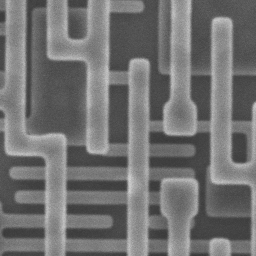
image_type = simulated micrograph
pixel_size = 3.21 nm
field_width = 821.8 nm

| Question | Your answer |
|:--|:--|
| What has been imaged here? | wiring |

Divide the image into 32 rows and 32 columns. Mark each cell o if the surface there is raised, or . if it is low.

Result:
.oo...oo...ooo........oo........
.oo...oo...ooo........oo........
.oo...oo...ooo........oo...oo...
.oo...oo...ooo........oo..ooo...
.oo...ooo..ooo.......ooo..ooo...
.oo...oooooooo.......ooo..ooo...
.oo...oooooooo.......ooo..ooo...
.oo.......oooo..oo...ooo..ooo...
.oo........ooo..ooo..ooo..ooo...
.oo........oo...ooo..ooo..ooo...
.oo........oo...ooo..ooo..ooo...
ooo........oo...ooo..ooo..ooo...
ooo........oo...ooo..ooo..ooo...
ooo........oo...ooo..ooo..ooo...
.oo........oo...ooo..ooo..ooo...
.oo........oo...ooo..ooo..ooo...
.oo........oo...ooo..ooo..ooo...
.ooooooo...oo...ooo.......ooo...
.ooooooo...oo...ooo.......ooo...
.....ooo........ooo.......ooo...
......oo........ooo.......oooooo
......oo........ooo.......oooooo
......oo........ooo..ooo..oooooo
......oo........ooo.ooooo......o
......oo........oo..ooooo.......
......oo........oo..ooooo.......
......oo........oo..ooooo.......
......oo........oo...ooo........
......oo........oo...ooo........
......oo........oo...ooo........
......oo........oo...ooo..ooo...
......oo........oo...ooo..ooo...